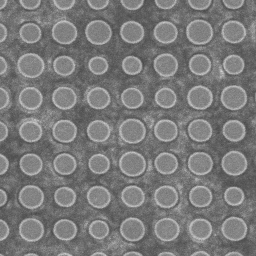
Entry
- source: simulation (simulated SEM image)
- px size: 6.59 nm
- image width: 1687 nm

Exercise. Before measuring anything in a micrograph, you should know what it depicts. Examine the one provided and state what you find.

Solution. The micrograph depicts a regular array of raised bodies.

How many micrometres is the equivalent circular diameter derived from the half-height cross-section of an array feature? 0.143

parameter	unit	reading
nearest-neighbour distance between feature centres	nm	216